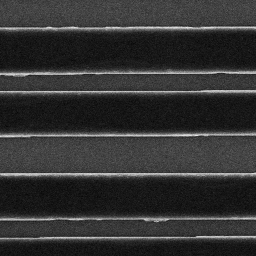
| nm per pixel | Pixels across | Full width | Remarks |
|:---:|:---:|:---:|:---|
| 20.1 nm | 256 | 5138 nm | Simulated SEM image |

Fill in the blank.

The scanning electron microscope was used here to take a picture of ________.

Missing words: lines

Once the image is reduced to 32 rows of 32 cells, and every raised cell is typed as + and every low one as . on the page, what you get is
................................
................................
................................
................++++++++.+++++++
++++++++++++++++++++++++++++++++
++++++++++++++++++++++++++++++++
++++++++++++++++++++++++++++++++
++++++++++++++++++++++++++++++++
++++++++++++++++++++++++++++++++
................................
................................
++++++++++++++++++++++++++++++++
++++++++++++++++++++++++++++++++
++++++++++++++++++++++++++++++++
++++++++++++++++++++++++++++++++
++++++++++++++++++++++++++++++++
++++++++++++++++++++++++++++++++
................................
................................
................................
................................
................................
++++++++++++++++++++++++++++++++
++++++++++++++++++++++++++++++++
++++++++++++++++++++++++++++++++
++++++++++++++++++++++++++++++++
++++++++++++++++++++++++++++++++
................................
................................
................................
++++++++++++++++++++++++++++++++
++++++++++++++++++++++++++++++++